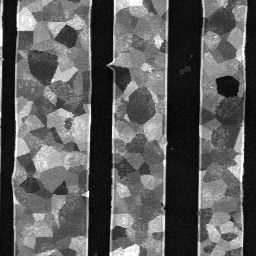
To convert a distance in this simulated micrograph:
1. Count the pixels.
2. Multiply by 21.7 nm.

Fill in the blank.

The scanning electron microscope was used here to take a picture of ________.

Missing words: one or a few lines or trenches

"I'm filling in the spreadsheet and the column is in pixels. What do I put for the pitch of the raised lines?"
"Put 84.9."